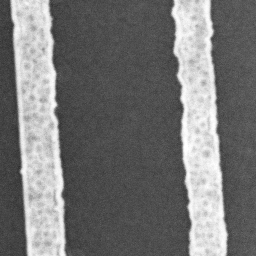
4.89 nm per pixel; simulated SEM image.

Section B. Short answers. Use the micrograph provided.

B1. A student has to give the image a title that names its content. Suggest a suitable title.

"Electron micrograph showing one or a few lines or trenches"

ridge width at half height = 0.156 um